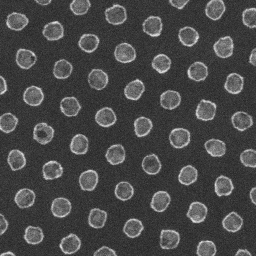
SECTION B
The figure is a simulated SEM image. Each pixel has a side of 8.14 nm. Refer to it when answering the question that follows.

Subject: a regular array of raised bodies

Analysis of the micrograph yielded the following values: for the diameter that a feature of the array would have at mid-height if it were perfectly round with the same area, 152 nm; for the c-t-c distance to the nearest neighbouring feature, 302 nanometres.